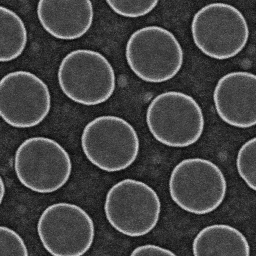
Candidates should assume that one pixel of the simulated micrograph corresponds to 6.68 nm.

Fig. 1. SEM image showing a regular array of raised bodies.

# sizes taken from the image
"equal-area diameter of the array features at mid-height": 0.358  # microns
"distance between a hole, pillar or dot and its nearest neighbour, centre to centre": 0.458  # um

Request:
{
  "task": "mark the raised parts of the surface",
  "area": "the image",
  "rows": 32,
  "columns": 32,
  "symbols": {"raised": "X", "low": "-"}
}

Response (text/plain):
-----XXXXXX---XXXXX-------------
X----XXXXXX----XXX-------XXXXX--
XX---XXXXXX-------------XXXXXX--
XXX---XXXXX--------X----XXXXXXX-
XXX----XXX-------XXXX---XXXXXXX-
XXX-------------XXXXXX---XXXXXX-
XX-------XX-----XXXXXXX---XXXX--
--------XXXXX---XXXXXXX---------
--------XXXXXX---XXXXX----------
-XXX---XXXXXXX---XXXX-------XXXX
XXXXX---XXXXXX-------------XXXXX
XXXXXX--XXXXXX-------------XXXXX
XXXXXX---XXXX------XXXXX---XXXXX
XXXXXX-------------XXXXXX--XXXXX
XXXXX-------------XXXXXXX---XXXX
-XXX-------XXXXX---XXXXXX----XXX
-----------XXXXXX--XXXXXX-------
----XX----XXXXXXX---XXXX--------
--XXXXXX--XXXXXXX-------------XX
--XXXXXX---XXXXXX-------------XX
--XXXXXXX---XXXX-------XXX----XX
--XXXXXXX-------------XXXXX---XX
---XXXXX-------------XXXXXXX---X
----XXX-------XXXXX--XXXXXXX----
--------------XXXXX---XXXXXX----
-------------XXXXXXX--XXXXX-----
------XXXX---XXXXXXX----XX------
-----XXXXXX---XXXXXX------------
-----XXXXXXX---XXXX-------XXX---
XX---XXXXXXX-------------XXXXX--
XXX--XXXXXX-------------XXXXXXX-
XXX---XXXX-------XXXX---XXXXXXX-